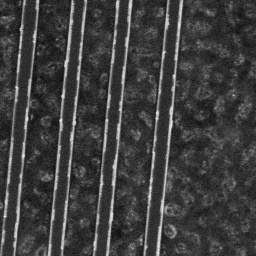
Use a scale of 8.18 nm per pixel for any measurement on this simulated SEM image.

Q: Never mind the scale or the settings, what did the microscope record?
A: parallel lines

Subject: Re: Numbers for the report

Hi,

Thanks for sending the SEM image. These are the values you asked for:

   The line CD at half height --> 119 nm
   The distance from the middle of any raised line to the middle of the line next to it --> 47.6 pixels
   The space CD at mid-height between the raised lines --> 33.1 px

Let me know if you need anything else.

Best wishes